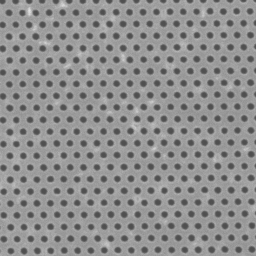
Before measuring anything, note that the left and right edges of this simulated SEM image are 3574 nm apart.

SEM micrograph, a regular array of holes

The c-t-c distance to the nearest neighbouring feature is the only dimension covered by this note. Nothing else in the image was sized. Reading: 184 nanometres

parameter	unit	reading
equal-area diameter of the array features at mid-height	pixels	7.23